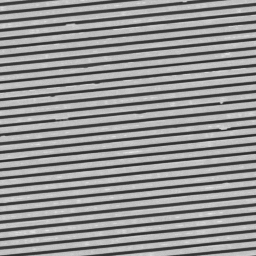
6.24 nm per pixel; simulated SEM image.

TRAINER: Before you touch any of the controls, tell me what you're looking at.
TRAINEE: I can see parallel lines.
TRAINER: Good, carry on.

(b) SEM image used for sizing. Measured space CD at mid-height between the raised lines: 12.4 nm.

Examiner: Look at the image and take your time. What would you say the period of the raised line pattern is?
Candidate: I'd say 54.1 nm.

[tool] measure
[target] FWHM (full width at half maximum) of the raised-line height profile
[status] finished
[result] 41.9 nm